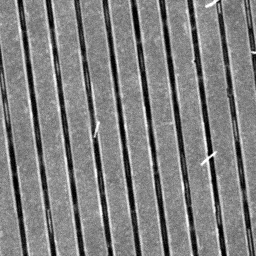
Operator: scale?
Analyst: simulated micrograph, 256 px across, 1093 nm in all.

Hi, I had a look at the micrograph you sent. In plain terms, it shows parallel lines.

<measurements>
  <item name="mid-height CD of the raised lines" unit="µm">0.0921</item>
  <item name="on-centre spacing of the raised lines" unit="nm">120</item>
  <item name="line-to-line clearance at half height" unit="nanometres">28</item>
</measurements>